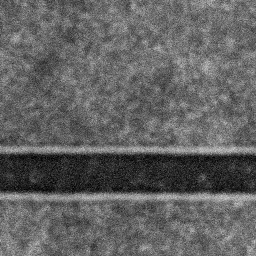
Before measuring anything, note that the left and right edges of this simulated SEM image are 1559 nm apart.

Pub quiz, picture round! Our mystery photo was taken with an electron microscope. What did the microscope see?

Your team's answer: one or a few lines or trenches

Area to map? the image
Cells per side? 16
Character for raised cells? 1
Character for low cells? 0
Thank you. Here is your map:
1111111111111111
1111111111111111
1111111111111111
1111111111111111
1111111111111111
1111111111111111
1111111111111111
1111111111111111
1111111111111111
0000000000000000
0000000000000000
0000000000000000
1111111111111111
1111111111111111
1111111111111111
1111111111111111